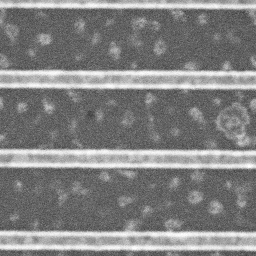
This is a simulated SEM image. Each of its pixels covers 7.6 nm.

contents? one or a few lines or trenches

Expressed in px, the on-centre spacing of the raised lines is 80.6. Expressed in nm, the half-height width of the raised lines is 103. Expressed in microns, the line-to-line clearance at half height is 0.507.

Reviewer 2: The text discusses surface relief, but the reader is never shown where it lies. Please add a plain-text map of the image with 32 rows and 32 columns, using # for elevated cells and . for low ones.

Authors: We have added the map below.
################################
................................
................................
................................
................................
................................
................................
................................
................................
################################
################################
................................
................................
................................
................................
................................
................................
................................
................................
################################
################################
................................
................................
................................
................................
................................
................................
................................
................................
################################
################################
................................